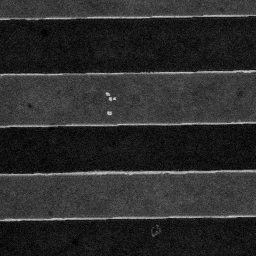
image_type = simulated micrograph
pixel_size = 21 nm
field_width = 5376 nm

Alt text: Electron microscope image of lines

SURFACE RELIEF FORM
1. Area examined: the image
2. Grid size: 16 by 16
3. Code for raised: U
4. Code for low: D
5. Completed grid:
UUUUUUUUUUUUUUUU
DDDDDDDDDDDDDDDD
DDDDDDDDDDDDDDDD
DDDDDDDDDDDDDDDD
DDDDDDDDDDDDDDUU
UUUUUUUUUUUUUUUU
UUUUUUUUUUUUUUUU
UUUUUUUUUUUUUUUU
DDDDDDDDDDDDDDDD
DDDDDDDDDDDDDDDD
DDDDDDDDDDDDDDDD
UUUUUUUUUUUUUUUU
UUUUUUUUUUUUUUUU
UUUUUUUUUUUUUUUU
DDDDDDDDDDDDDDDD
DDDDDDDDDDDDDDDD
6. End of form